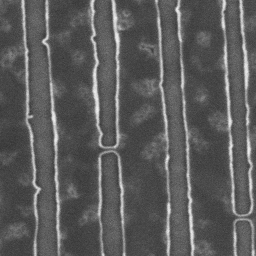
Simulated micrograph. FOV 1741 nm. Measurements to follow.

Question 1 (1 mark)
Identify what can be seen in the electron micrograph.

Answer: one or a few lines or trenches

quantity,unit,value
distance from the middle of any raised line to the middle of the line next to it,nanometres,447